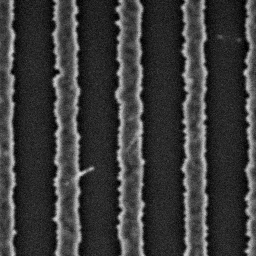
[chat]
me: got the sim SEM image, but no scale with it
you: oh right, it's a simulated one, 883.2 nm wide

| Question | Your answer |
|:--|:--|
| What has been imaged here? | lines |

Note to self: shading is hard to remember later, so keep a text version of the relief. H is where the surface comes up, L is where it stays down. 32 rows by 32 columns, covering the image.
HHLLLLLHHLLLLLLHHHLLLLLHHLLLLLLH
HHLLLLLHHHLLLLLHHHLLLLLHHLLLLLLH
HHLLLLLHHLLLLLLHHHLLLLLHHLLLLLLH
HLLLLLLHHLLLLLLHHLLLLLLHHHLLLLLH
HHLLLLLHHHLLLLLHHLLLLLLHHHLLLLLH
HHLLLLLHHHLLLLLHHLLLLLLHHLLLLLLH
HHLLLLLHHHLLLLLHHHLLLLLHHLLLLLLH
HHLLLLLHHHLLLLLHHLLLLLLHHLLLLLLH
HLLLLLLHHHLLLLLHHHLLLLLHHHLLLLLH
HHLLLLLHHHLLLLLHHHLLLLLHHHLLLLLH
HHLLLLLHHHLLLLLHHHLLLLLHHHLLLLLH
HHLLLLLHHHLLLLLHHLLLLLLHHHLLLLLH
HLLLLLLHHHLLLLLHHLLLLLLHHLLLLLLH
HHLLLLLHHHLLLLLHHHLLLLLHHHLLLLLH
HHLLLLLHHHLLLLLHHLLLLLLHHHLLLLLH
HLLLLLLHHHLLLLLHHHLLLLLHHLLLLLLH
HHLLLLLHHHLLLLLHHHLLLLLHHHLLLLLH
HHLLLLLHHHLLLLLHHHLLLLLHHHLLLLLH
HHLLLLLHHHLLLLLHHHLLLLLHHHLLLLLH
HHLLLLLHHHLLLLLHHHLLLLLHHLLLLLLH
HHLLLLLHHHLLLLLHHHLLLLLHHHLLLLLH
HHLLLLLHHHLLLLLHHHLLLLLHHHLLLLLH
HHLLLLLHHHLLLLLHHHLLLLLHHHLLLLLH
HHLLLLLHHHLLLLLHHHLLLLLHHHLLLLLH
HHLLLLLHHHLLLLLHHHLLLLLHHHLLLLLH
HHLLLLLHHHLLLLLHHHLLLLLHHHLLLLLH
HHLLLLLHHHLLLLLHHHLLLLLHHHLLLLLH
HHLLLLLHHHLLLLLHHHLLLLLHHHLLLLLH
HHLLLLLHHHLLLLLHHHLLLLLHHHLLLLLH
HHLLLLLHHHLLLLLHHHLLLLLHHHLLLLLH
HHLLLLLHHHLLLLLHHHLLLLLHHHLLLLLH
HHLLLLLHHHLLLLLHHHLLLLLHHHLLLLLH